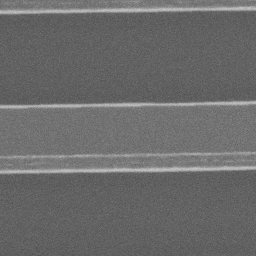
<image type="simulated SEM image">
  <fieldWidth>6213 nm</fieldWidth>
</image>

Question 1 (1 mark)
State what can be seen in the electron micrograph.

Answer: lines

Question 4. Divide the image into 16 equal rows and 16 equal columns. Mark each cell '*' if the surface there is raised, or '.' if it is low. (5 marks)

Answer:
***************.
................
................
................
................
................
..............**
****************
****************
****************
***************.
................
................
................
................
................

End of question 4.